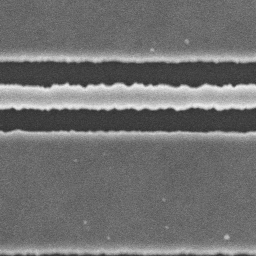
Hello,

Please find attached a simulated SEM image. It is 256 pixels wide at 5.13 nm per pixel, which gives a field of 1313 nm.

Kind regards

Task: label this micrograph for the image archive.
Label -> lines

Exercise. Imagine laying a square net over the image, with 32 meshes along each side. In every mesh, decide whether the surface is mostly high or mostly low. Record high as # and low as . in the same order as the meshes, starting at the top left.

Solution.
################################
################################
################################
################################
################################
################################
################################
################################
................................
................................
..............#..#..............
################################
################################
########################.#######
................................
................................
########################..##...#
################################
################################
################################
################################
################################
################################
################################
################################
################################
################################
################################
################################
################################
################################
################################